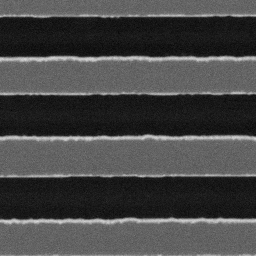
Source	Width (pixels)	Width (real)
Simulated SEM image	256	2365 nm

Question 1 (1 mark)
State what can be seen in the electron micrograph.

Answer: lines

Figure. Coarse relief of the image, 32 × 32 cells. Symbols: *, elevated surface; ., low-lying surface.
********************************
********************************
................................
................................
................................
................................
................................
********************************
********************************
********************************
********************************
********************************
................................
................................
................................
................................
................................
********************************
********************************
********************************
********************************
********************************
................................
................................
................................
................................
................................
........*...*.****.***********.*
********************************
********************************
********************************
********************************